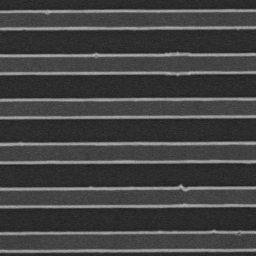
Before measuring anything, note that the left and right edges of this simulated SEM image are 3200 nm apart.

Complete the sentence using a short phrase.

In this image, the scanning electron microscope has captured parallel lines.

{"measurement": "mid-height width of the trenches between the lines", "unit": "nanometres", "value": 320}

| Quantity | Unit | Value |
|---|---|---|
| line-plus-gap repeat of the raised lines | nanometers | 555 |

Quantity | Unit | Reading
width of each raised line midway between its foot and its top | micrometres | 0.231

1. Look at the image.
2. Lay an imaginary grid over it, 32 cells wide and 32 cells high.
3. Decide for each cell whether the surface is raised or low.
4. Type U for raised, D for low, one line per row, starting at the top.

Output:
DDDDDDDDDDDDDDDDDDDDDDDDDDDDDDDD
DUUUUUUUUUUUUUUUUUUUUUUUUUUUUUUU
UUUUUUUUUUUUUUUUUUUUUUUUUUUUUUUU
UUUUUUUUUUUUUUUUUUUUUUUUUUDDDDDD
DDDDDDDDDDDDDDDDDDDDDDDDDDDDDDDD
DDDDDDDDDDDDDDDDDDDDDDDDDDDDDDDD
DDDDDDDDDDDDDDDDDDDDDDDDDDDDDDDD
UUUUUUUUUUUUUUUUUUUUUUUUUUUUUUUU
UUUUUUUUUUUUUUUUUUUUUUUUUUUUUUUU
DDDDDDDDDDDDDDDDDDDDDDDDDDDDDDDD
DDDDDDDDDDDDDDDDDDDDDDDDDDDDDDDD
DDDDDDDDDDDDDDDDDDDDDDDDDDDDDDDD
DDUUUDDDDDDDDDDUUUUUUUUUUUUUUUUU
UUUUUUUUUUUUUUUUUUUUUUUUUUUUUUUU
UUUUUUUUUUUUUUUUUUUUUUUUUUUUUUUU
DDDDDDDDDDDDDDDDDDDDDDDDDDDDDDDD
DDDDDDDDDDDDDDDDDDDDDDDDDDDDDDDD
DDDDDDDDDDDDDDDDDDDDDDDDDDDDDDDD
UUUUUUUUUUUUUUUUUUUUUUUUUUUUUUUU
UUUUUUUUUUUUUUUUUUUUUUUUUUUUUUUU
DDDDDDDDDDDDDDDDDDDDDDDDDDDDDDDD
DDDDDDDDDDDDDDDDDDDDDDDDDDDDDDDD
DDDDDDDDDDDDDDDDDDDDDDDDDDDDDDDD
DDDDDDDDDDDDDDDDDDDDDDUUUUUUUUUU
UUUUUUUUUUUUUUUUUUUUUUUUUUUUUUUU
UUUUUUUUUUUUUUUUUUUUUUUUUUUUUUUU
DDDDDDDDDDDDDDDDDDDDDDDDDDDDDDDD
DDDDDDDDDDDDDDDDDDDDDDDDDDDDDDDD
DDDDDDDDDDDDDDDDDDDDDDDDDDDDDDDD
UUUUUUUUUUUUUUUUUUUUUUUUUUUUUUUU
UUUUUUUUUUUUUUUUUUUUUUUUUUUUUUUU
DDDDDDDDDDDDDDDDDDDDDDDDDDDDDDDD